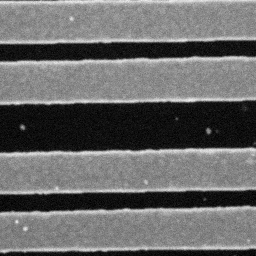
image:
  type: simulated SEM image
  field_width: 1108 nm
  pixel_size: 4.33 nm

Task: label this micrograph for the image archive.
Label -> lines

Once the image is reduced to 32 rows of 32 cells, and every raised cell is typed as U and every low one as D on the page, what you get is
UUUUUUUUUUUUUUUUUUUUUUUUUUUUUUUU
UUUUUUUUUUUUUUUUUUUUUUUUUUUUUUUU
UUUUUUUUUUUUUUUUUUUUUUUUUUUUUUUU
UUUUUUUUUUUUUUUUUUUUUUUUUUUUUUUU
UUUUUUUUUUUUUUUUUUUUUUUUUUUUUUUU
DDDDDDDDDDDDDDDDDDDDDDDDDDDDDDDD
DDDDDDDDDDDDDDDDDDDDDDDDDDDDDDDD
DDDDDDDDDDDDDDDUUUUUUUUUUUUUUUUU
UUUUUUUUUUUUUUUUUUUUUUUUUUUUUUUU
UUUUUUUUUUUUUUUUUUUUUUUUUUUUUUUU
UUUUUUUUUUUUUUUUUUUUUUUUUUUUUUUU
UUUUUUUUUUUUUUUUUUUUUUUUUUUUUUUU
UUUUUUUUUUUUUUUUUUUUUUUUUUUUUUUD
DDDDDDDDDDDDDDDDDDDDDDDDDDDDDDDD
DDDDDDDDDDDDDDDDDDDDDDDDDDDDDDDD
DDDDDDDDDDDDDDDDDDDDDDDDDDDDDDDD
DDDDDDDDDDDDDDDDDDDDDDDDDDDDDDDD
DDDDDDDDDDDDDDDDDDDDDDDDDDDDDDDD
DDDDDDDDDDDDDDDDDDDDDDDDDDDDDDDD
UUUUUUUUUUUUUUUUUUUUUUUUUUUUUUUU
UUUUUUUUUUUUUUUUUUUUUUUUUUUUUUUU
UUUUUUUUUUUUUUUUUUUUUUUUUUUUUUUU
UUUUUUUUUUUUUUUUUUUUUUUUUUUUUUUU
UUUUUUUUUUUUUUUUUUUUUUUUUUUUUUUU
DDDDDDDDDDDDDDDDDDDDDDDDDDDDDDDD
DDDDDDDDDDDDDDDDDDDDDDDDDDDDDDDD
DDDDDDUUUUUUUUUUUUUUUUUUUUUUUUUU
UUUUUUUUUUUUUUUUUUUUUUUUUUUUUUUU
UUUUUUUUUUUUUUUUUUUUUUUUUUUUUUUU
UUUUUUUUUUUUUUUUUUUUUUUUUUUUUUUU
UUUUUUUUUUUUUUUUUUUUUUUUUUUUUUUU
UDDDDDDDDDDDDDDDDDDDDDDDDDDDDDDD